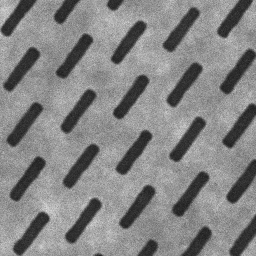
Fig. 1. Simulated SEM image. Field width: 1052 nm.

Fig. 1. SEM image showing a regular array of holes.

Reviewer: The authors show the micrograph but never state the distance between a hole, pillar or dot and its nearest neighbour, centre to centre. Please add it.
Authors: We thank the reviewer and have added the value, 223 nanometers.